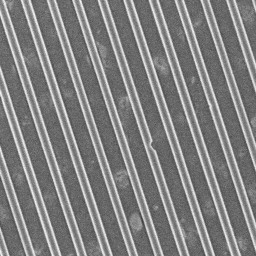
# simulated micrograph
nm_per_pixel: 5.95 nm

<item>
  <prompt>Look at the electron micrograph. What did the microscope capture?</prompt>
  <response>parallel lines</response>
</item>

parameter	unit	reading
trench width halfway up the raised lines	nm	99.9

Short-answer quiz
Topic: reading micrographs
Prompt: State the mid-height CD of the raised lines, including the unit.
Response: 7.97 px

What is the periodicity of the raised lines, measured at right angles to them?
0.145 micrometres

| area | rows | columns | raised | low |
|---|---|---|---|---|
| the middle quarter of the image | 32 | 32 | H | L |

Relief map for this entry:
LHHLLLLLHLLLLLHHLLLLHHLLLLLHHLLL
LHHLLLLLHHLLLLHHLLLLHHHLLLLHHLLL
LLHHLLLLHHLLLLLHHLLLLHHLLLLHHLLL
LLHHLLLLLHLLLLLHHLLLLHHLLLLLHHLL
LLHHLLLLLHHLLLLHHLLLLHHHLLLLHHLL
LLLHHLLLLHHLLLLHHHLLLLHHLLLLHHLL
LLLHHLLLLLHLLLLLHHLLLLHHLLLLLHHL
LLLHHLLLLLHHLLLLHHLLLLHHHLLLLHHL
LLLLHHLLLLHHLLLLHHHLLLLHHLLLLHHL
LLLLHHLLLLHHLLLLLHHLLLLHHLLLLLHH
LLLLHHLLLLLHHLLLLHHLLLLHHLLLLLHH
LLLLLHHLLLLHHLLLLHHHLLLLHHLLLLHH
HLLLLHHLLLLHHLLLLLHHLLLLHHLLLLLH
HLLLLHHLLLLLHHLLLLHHLLLLHHHLLLLH
HLLLLLHHLLLLHHLLLLHHLLLLLHHLLLLH
HLLLLLHHLLLLHHLLLLLHHLLLLHHLLLLL
HHLLLLHHLLLLLHHLLLLHHLLLLHHHLLLL
HHLLLLLHHLLLLHHLLLLHHLLLLLHHLLLL
HHLLLLLHHLLLLHHLLLLLHHLLLLHHLLLL
LHHLLLLHHLLLLLHHLLLLHHLLLLHHHLLL
LHHLLLLLHHLLLLHHLLLLHHLLLLLHHLLL
LHHLLLLLHHLLLLHHLLLLLHHLLLLHHLLL
LLHHLLLLHHLLLLLHHLLLLHHLLLLHHHLL
LLHHLLLLHHHLLLLHHLLLLHHLLLLLHHLL
LLHHLLLLLHHLLLLHHLLLLLHHLLLLHHLL
LLLHHLLLLHHLLLLLHHLLLLHHLLLLHHHL
LLLHHLLLLHHHLLLLHHLLLLHHLLLLLHHL
LLLHHLLLLLHHLLLLHHLLLLLHHLLLLHHL
LLLLHHLLLLHHLLLLLHLLLLLHHLLLLHHL
LLLLHHLLLLHHHLLLLHHLLLLHHLLLLLHH
LLLLHHLLLLLHHLLLLHHLLLLLHHLLLLHH
LLLLLHHLLLLHHLLLLLHLLLLLHHLLLLHH